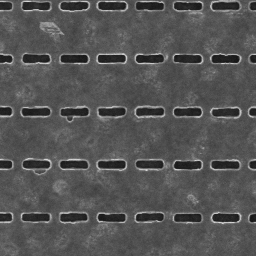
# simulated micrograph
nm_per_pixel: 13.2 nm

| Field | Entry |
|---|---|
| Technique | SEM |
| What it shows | a regular array of holes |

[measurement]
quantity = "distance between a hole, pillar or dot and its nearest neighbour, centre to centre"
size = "37.7 px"